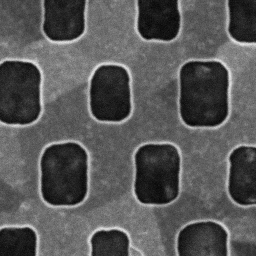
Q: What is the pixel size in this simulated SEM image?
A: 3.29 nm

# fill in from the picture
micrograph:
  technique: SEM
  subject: holes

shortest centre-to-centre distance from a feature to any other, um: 0.304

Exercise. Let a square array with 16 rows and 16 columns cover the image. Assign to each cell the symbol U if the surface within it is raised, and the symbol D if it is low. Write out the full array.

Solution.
UUUDDUUUUDDUUUDD
UUUDDUUUUDDUUUDD
UUUDDUUUUDDUUUUD
UUUUUUUUUUUUUUUU
DDUUUUDDUUUDDDUU
DDDUUUDDUUUDDDUU
DDDUUUDDUUUDDDUU
DDUUUUDDUUUDDDUU
UUUUUUUUUUUUUUUU
UUUDDUUUUDDUUUUD
UUUDDDUUDDDUUUDD
UUUDDDUUDDDUUUDD
UUUDDUUUUDDUUUUD
UUUUUUUUUUUUUUUU
DDUUUUDDUUUDDDUU
DDUUUUDDUUUDDDUU